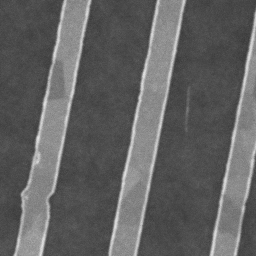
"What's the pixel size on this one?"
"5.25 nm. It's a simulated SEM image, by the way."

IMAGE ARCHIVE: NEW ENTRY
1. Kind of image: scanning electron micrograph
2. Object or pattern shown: one or a few lines or trenches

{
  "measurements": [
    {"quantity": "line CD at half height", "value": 128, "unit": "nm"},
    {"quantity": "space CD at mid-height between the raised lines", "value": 367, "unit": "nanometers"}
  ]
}